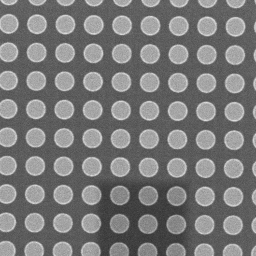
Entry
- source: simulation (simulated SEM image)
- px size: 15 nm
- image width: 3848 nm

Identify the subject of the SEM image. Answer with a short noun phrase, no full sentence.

an array of small figures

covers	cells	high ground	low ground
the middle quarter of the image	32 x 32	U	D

DDDDDDDDDDDDDDDDDDDDDDDDDDDDDDDD
DDDDDDDDDDDDDDDDDDDDDDDDDDDDDDDD
UUDDDDUUUDDDDUUDDDDDUUDDDDDDDDDD
UUDDDUUUUDDDUUUUUDDUUUUUDDUUUUUD
UUDDDUUUUDDDUUUUUDDUUUUUDDUUUUUD
UUDDDUUUUDDDUUUUDDDUUUUUDDUUUUUD
UDDDDDUUDDDDDUUUDDDDUUUDDDDUUUDD
DDDDDDDDDDDDDDDDDDDDDDDDDDDDDDDD
DDDDDDDDDDDDDDDDDDDDDDDDDDDDDDDD
UDDDDDUUDDDDDUUDDDDDDUDDDDDDDDDD
UUDDDUUUUDDDUUUUDDDUUUUDDDUUUUDD
UUDDDUUUUDDDUUUUDDDUUUUUDDUUUUUD
UUDDDUUUUDDDUUUUDDDUUUUDDDUUUUUD
UDDDDDUUDDDDDUUUDDDDUUUDDDDUUUDD
DDDDDDDDDDDDDDDDDDDDDDDDDDDDDDDD
DDDDDDDDDDDDDDDDDDDDDDDDDDDDDDDD
UDDDDDUUDDDDDUUDDDDDDUDDDDDDDDDD
UUDDDUUUUDDDUUUUDDDUUUUDDDDUUUDD
UUDDDUUUUDDDUUUUDDDUUUUUDDUUUUUD
UUDDDUUUUDDDUUUUDDDUUUUUDDUUUUUD
UDDDDDUUDDDDDUUUDDDDUUUDDDDUUUDD
DDDDDDDDDDDDDDDDDDDDDDDDDDDDDDDD
DDDDDDDDDDDDDDDDDDDDDDDDDDDDDDDD
UDDDDDUUDDDDDDDDDDDDDDDDDDDDDDDD
UUDDDUUUUDDDUUUUDDDUUUUDDDUUUUDD
UUDDDUUUUDDDUUUUDDDUUUUDDDUUUUDD
UUDDDUUUUDDDUUUUDDDUUUUDDDUUUUDD
UDDDDUUUDDDDUUUUDDDDUUUDDDUUUUDD
DDDDDDDDDDDDDDDDDDDDDDDDDDDDDDDD
DDDDDDDDDDDDDDDDDDDDDDDDDDDDDDDD
UDDDDDUDDDDDDDDDDDDDDDDDDDDDDDDD
UUDDDUUUUDDDUUUUDDDUUUUDDDUUUUDD